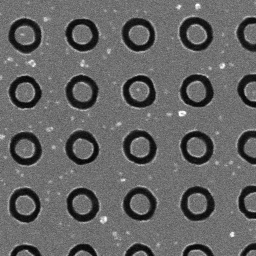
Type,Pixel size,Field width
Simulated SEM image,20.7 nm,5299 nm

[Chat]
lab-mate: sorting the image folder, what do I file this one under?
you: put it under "a regular array of ring-shaped grooves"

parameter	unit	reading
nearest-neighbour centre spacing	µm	1.16